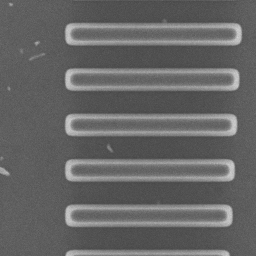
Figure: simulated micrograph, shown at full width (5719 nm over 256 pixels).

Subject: groups of lines, slits or small figures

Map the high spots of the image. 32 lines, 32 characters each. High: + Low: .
................................
................................
................................
.........+++++++++++++++++++++..
.........+++++++++++++++++++++..
................................
................................
................................
................................
.........+++++++++++++++++++++..
.........+++++++++++++++++++++..
................................
................................
................................
................................
.........++++++++++++++++++++...
.........++++++++++++++++++++...
................................
................................
................................
.........++++++++++++++++++++...
.........++++++++++++++++++++...
................................
................................
................................
................................
.........++++++++++++++++++++...
.........++++++++++++++++++++...
................................
................................
................................
................................